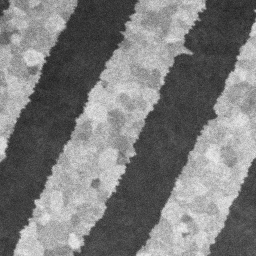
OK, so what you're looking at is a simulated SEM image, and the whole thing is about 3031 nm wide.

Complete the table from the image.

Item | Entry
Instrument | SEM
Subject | one or a few lines or trenches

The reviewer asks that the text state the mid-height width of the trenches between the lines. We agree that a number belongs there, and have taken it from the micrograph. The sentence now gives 0.656 micrometres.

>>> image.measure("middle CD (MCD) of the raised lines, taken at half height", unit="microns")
0.643